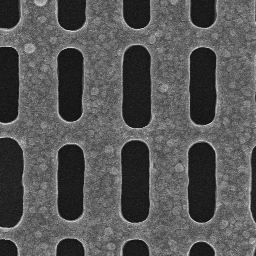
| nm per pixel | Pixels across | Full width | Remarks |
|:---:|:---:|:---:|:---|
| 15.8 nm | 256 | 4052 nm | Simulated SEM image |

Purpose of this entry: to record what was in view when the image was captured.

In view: holes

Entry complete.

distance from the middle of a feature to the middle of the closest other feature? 1040 nanometers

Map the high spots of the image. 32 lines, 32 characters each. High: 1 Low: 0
00111110000111100001111100011111
00011110000111100001111100011111
00111110000111110001111100011111
01111111001111111011111111111111
11111111111111111111111111111111
11111111111111111111111111111111
00111111001111110001111100011111
00111110001111100001111100011111
00111110000111100001111100011111
00111110000111100001111100011111
00111110000111100001111100011111
00111110001111100001111100011111
00111110001111100001111100011111
00111110001111100001111100011111
00111111001111100001111100011111
11111111111111110001111110111111
11111111111111111111111111111111
00111111111111111111111111111111
00011111001111100001111100011111
00011110001111100001111000011110
00011110000111100001111000011110
00011110000111100001111000011110
00011110000111100001111100011110
00011110001111100001111000011110
00011110001111100001111000011110
00011110001111100001111100011110
00011110001111100001111100011110
00111111011111110011111100111111
11111111111111111111111111111111
11111111111111111111111111111111
00111110001111110011111110111111
00111110000111100001111100011111